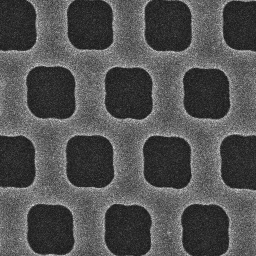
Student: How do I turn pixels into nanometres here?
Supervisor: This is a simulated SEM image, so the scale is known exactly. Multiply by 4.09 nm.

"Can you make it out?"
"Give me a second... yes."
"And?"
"holes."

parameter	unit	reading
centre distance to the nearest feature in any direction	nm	317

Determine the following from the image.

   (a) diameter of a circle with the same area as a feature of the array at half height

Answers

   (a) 220 nm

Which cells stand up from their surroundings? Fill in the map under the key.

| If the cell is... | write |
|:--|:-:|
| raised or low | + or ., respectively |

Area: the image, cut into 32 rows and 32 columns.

....+++++.....+++++....+++++....
....++++......++++......++++....
....++++......++++......++++....
....++++......++++......++++....
.....+++......++++......++++....
....+++++.....++++......++++....
++++++++++++++++++++++++++++++++
++++++++++++++++++++++++++++++++
++++....++++++....++++++++++++++
+++......++++......++++.....++++
+++......++++......++++......+++
+++......++++......++++......+++
+++......++++......++++......+++
++++.....++++......++++......+++
++++.....+++++....++++++....++++
++++++++++++++++++++++++++++++++
++++++++++++++++++++++++++++++++
....+++++.....++++.....+++++....
....++++......++++......++++....
....++++......++++......++++....
....++++......++++......++++....
.....+++......++++......++++....
....+++++.....++++......++++....
++.+++++++++++++++++...++++++...
++++++++++++++++++++++++++++++++
++++++++++++++++++++++++++++++++
++++.....++++......++++.....++++
+++......++++......++++......+++
++++.....++++......++++......+++
+++......++++......++++......+++
++++.....++++......++++......+++
++++.....+++++....+++++.....++++